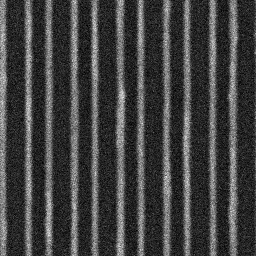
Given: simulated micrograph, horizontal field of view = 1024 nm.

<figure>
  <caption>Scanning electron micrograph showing parallel lines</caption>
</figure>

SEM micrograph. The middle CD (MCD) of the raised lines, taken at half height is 20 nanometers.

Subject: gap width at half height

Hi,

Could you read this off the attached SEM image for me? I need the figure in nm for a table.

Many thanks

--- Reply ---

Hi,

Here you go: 72.8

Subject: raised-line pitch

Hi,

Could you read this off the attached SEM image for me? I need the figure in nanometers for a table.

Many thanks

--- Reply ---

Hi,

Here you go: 91.1